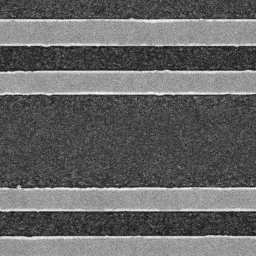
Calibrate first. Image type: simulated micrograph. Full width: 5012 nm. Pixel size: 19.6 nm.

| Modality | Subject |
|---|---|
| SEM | lines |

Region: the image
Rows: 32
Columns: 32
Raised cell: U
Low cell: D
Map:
DDDDDDDDDDDDDDDDDDDDDDDDDDDDDDDD
DDDDDDDDDDDDDDDDDDDDDDDDDDDDDDDD
DDDDDDDDDDDDDDDDUDDDDDDDDUDDDDDD
UUUUUUUUUUUUUUUUUUUUUUUUUUUUUUUU
UUUUUUUUUUUUUUUUUUUUUUUUUUUUUUUU
UUUUUUUUUUUUUUUUUUUUUUUUUUUUUUUU
DDDDDDDDDDDDDDDDDDDDDDDDDDDDDDDD
DDDDDDDDDDDDDDDDDDDDDDDDDDDDDDDD
DDDDDDDDDDDDDDDDDDDDDDDDDDDDDDDD
UUUUUUUUUUUUUUUUUUUUUUUUUUUUUUUU
UUUUUUUUUUUUUUUUUUUUUUUUUUUUUUUU
UUUUUUUUUUUUUUUUUUUUUUUUUUUUUUUU
DDDDDDDDDDDDDDDDDDDDDDDDDDDDDDDD
DDDDDDDDDDDDDDDDDDDDDDDDDDDDDDDD
DDDDDDDDDDDDDDDDDDDDDDDDDDDDDDDD
DDDDDDDDDDDDDDDDDDDDDDDDDDDDDDDD
DDDDDDDDDDDDDDDDDDDDDDDDDDDDDDDD
DDDDDDDDDDDDDDDDDDDDDDDDDDDDDDDD
DDDDDDDDDDDDDDDDDDDDDDDDDDDDDDDD
DDDDDDDDDDDDDDDDDDDDDDDDDDDDDDDD
DDDDDDDDDDDDDDDDDDDDDDDDDDDDDDDD
DDDDDDDDDDDDDDDDDDDDDDDDDDDDDDDD
DDDDDDDDDDDDDDDDDDDDDDDDDDDDDDDD
DDDDDDDDDDDDDDDDDDDDDDDDDDDDDDDD
UUUUUUUUUUUUUUUUUUUUUUUUUUUUUUUU
UUUUUUUUUUUUUUUUUUUUUUUUUUUUUUUU
DDDDDDDDDDDDDDDDDDDDDDDDDDDDDDDD
DDDDDDDDDDDDDDDDDDDDDDDDDDDDDDDD
DDDDDDDDDDDDDDDDDDDDDDDDDDDDDDDD
DDDDDDDDDDDDDDDDDUDDDDDDDUUUUDDD
UUUUUUUUUUUUUUUUUUUUUUUUUUUUUUUU
UUUUUUUUUUUUUUUUUUUUUUUUUUUUUUUU